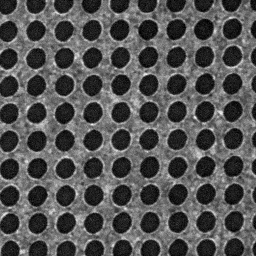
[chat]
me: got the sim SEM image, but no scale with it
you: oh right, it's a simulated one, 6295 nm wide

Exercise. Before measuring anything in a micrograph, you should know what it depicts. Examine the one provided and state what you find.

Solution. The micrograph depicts a regular array of holes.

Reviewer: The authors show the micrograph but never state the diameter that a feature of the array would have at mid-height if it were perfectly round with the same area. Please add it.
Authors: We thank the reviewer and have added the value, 527 nm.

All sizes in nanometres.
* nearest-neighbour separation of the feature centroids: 673